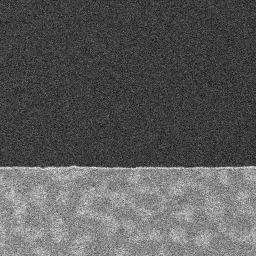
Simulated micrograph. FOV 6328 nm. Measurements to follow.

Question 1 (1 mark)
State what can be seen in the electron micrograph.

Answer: one or a few lines or trenches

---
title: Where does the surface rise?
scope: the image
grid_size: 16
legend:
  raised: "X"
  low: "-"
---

----------------
----------------
----------------
----------------
----------------
----------------
----------------
----------------
----------------
----------------
---XXX---------X
XXXXXXXXXXXXXXXX
XXXXXXXXXXXXXXXX
XXXXXXXXXXXXXXXX
XXXXXXXXXXXXXXXX
XXXXXXXXXXXXXXXX